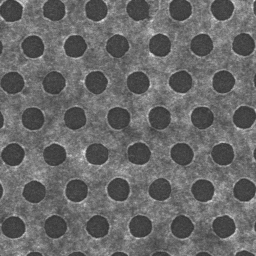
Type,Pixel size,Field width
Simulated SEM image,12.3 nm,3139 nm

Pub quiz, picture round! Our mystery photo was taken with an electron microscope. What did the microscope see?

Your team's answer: a regular array of holes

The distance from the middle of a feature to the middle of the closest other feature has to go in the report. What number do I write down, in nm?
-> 509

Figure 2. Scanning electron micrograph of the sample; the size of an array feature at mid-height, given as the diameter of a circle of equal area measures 284 nanometers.